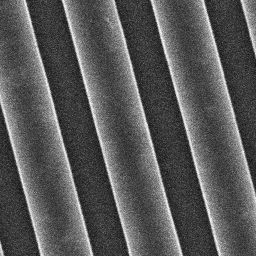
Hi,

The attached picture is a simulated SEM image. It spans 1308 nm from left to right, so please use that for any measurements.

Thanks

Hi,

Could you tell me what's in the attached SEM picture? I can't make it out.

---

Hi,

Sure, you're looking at one or a few lines or trenches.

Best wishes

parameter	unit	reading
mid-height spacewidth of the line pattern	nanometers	186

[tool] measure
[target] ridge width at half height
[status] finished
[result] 0.257 microns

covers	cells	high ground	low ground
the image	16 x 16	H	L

HHLLHHHLLLHHHLLH
HHLLHHHHLLHHHLLH
HHLLLHHHLLHHHLLL
HHHLLHHHLLHHHHLL
HHHLLHHHLLLHHHLL
HHHLLHHHHLLHHHLL
HHHLLLHHHLLHHHLL
HHHHLLHHHLLHHHHL
LHHHLLHHHLLLHHHL
LHHHLLHHHHLLHHHL
LHHHLLLHHHLLHHHH
LHHHHLLHHHLLLHHH
LLHHHLLHHHLLLHHH
LLHHHLLHHHHLLHHH
LLHHHLLLHHHLLHHH
LLHHHHLLHHHLLLHH